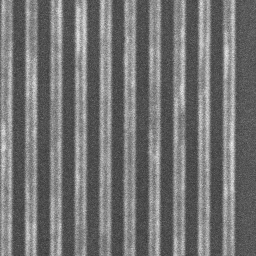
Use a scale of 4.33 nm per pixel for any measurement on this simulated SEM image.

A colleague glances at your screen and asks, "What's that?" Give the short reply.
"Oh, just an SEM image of parallel lines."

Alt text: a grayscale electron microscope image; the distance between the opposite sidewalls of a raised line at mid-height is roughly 41.1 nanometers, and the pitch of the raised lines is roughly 24.7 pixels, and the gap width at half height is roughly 65.5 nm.